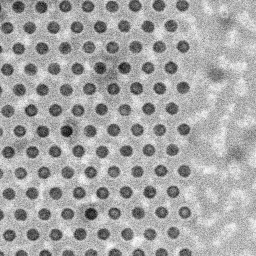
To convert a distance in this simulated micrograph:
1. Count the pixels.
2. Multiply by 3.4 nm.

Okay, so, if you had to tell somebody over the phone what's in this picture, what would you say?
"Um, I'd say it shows a regular array of holes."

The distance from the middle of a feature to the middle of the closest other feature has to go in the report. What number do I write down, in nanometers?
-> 78.7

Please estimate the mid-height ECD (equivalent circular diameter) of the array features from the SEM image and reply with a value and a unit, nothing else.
44.9 nanometers